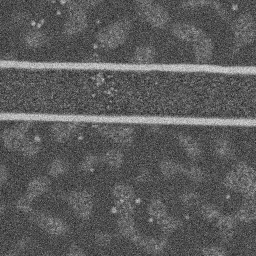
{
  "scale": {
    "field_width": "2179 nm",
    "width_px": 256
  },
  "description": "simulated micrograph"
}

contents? one or a few lines or trenches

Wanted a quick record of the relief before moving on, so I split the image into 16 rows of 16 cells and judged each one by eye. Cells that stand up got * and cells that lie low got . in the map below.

****************
****************
****************
****************
................
................
................
*******.........
****************
****************
****************
****************
****************
****************
****************
****************